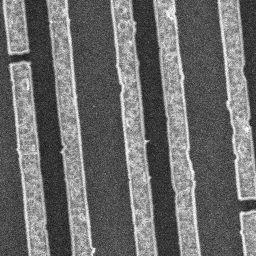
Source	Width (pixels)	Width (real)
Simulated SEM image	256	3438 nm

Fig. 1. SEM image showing parallel lines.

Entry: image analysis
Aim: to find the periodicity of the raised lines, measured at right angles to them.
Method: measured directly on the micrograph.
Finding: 704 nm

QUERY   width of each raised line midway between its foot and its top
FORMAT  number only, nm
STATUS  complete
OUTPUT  246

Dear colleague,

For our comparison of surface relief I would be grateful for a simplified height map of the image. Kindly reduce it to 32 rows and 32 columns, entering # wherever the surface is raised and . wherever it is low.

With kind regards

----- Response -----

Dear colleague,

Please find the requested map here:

.##...##......##...###.....###..
.##...##......##...###.....###..
.##...###.....###...##......##..
.##...###.....###...##......##..
.##...###.....###...##......##..
.##....##......##...##......##..
.##....##......##...##......##..
.......##......##...##......##..
.###...##......##...###.....##..
.###...##......##...###.....##..
..##...##......##...###.....###.
..##...##......##....##......##.
..##...##......###...##......##.
..##...###.....###...##......##.
..##...###.....###...##......##.
..##....##.....###...##......##.
..###...##......##...##......##.
..###...##......##...###.....##.
..###...##......##...###.....###
..###...##......##...##.......##
...##...##......##...###......##
...##...##......##....##......##
...##...##......###...##......##
...##...###.....###...##......##
...##....##.....###...##......##
...##....##......##...##........
...###...##......##...##.......#
...###...##......##...##......##
...###...##......##...###.....##
...###...##......##...###.....##
....##...##......##...###.....##
....##...###.....###...##......#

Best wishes